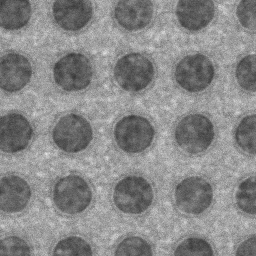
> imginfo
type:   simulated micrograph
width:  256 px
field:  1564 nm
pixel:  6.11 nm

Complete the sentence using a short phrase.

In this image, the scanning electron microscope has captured a regular array of raised bodies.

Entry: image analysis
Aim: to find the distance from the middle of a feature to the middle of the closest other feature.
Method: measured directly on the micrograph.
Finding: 371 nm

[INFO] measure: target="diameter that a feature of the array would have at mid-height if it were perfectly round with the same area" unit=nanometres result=253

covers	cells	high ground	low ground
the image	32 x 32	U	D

UUUUDDDUUUUUDDDUUUUDDDUUUUUDDDUU
UUUUDDUUUUUUDDUUUUUDDDUUUUUDDUUU
UUUUDDDUUUUDDDUUUUUDDDUUUUUDDDUU
UUUDDDDDUUDDDDDUUUDDDDDUUUDDDDUU
DDDDDDDDDDDDDDDDDDDDDDDDDDDDDDDD
DDDDDDDDDDDDDDDDDDDDDDDDDDDDDDDD
DDDDDDDDDDDDDDDDDDDDDDDDDDDDDDDD
UUUUDDDUUUUDDDDUUUUDDDUUUUDDDDUU
UUUUDDDUUUUUDDUUUUUDDDUUUUUDDUUU
UUUUDDDUUUUUDDUUUUUDDDUUUUUDDUUU
UUUUDDDUUUUDDDDUUUUDDDUUUUDDDDUU
DUDDDDDDUUDDDDDDUDDDDDDDUDDDDDDU
DDDDDDDDDDDDDDDDDDDDDDDDDDDDDDDD
DDDDDDDDDDDDDDDDDDDDDDDDDDDDDDDD
UUUDDDDDUUDDDDDDUUDDDDDUUUDDDDDU
UUUUDDDUUUUDDDUUUUUDDDUUUUUDDDUU
UUUUDDUUUUUUDDUUUUUDDDUUUUUDDUUU
UUUUDDDUUUUUDDUUUUUDDDUUUUUDDUUU
UUUDDDDUUUUDDDDUUUUDDDUUUUDDDDUU
DDDDDDDDDDDDDDDDDDDDDDDDDDDDDDDD
DDDDDDDDDDDDDDDDDDDDDDDDDDDDDDDD
DDDDDDDDDDDDDDDDDDDDDDDDDDDDDDDD
UUUDDDDUUUUDDDDUUUDDDDDUUUDDDDUU
UUUUDDDUUUUDDDUUUUUDDDUUUUUDDDUU
UUUUDDUUUUUUDDUUUUUDDDUUUUUDDUUU
UUUUDDDUUUUDDDUUUUUDDDUUUUDDDDUU
UUUDDDDDUUDDDDDUUUDDDDDUUUDDDDUU
DDDDDDDDDDDDDDDDDDDDDDDDDDDDDDDD
DDDDDDDDDDDDDDDDDDDDDDDDDDDDDDDD
DUDDDDDDDUDDDDDDUDDDDDDDDDDDDDDD
UUUUDDDUUUUDDDDUUUUDDDUUUUDDDDUU
UUUUDDDUUUUUDDUUUUUDDDUUUUUDDUUU